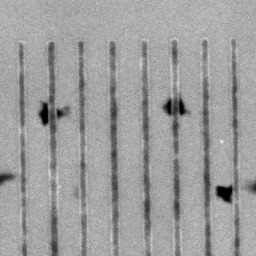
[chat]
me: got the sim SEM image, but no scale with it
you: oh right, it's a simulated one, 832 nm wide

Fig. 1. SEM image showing parallel lines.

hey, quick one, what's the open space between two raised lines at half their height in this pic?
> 71.9 nm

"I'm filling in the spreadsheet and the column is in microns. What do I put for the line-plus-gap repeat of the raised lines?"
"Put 0.0986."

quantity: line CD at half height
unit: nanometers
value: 26.8